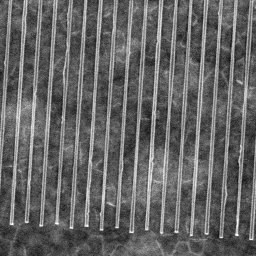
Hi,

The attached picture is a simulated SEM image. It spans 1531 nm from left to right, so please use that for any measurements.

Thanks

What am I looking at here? parallel lines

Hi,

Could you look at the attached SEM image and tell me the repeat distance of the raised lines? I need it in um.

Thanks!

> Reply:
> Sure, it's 0.0899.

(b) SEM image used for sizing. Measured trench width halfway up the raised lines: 71.6 nm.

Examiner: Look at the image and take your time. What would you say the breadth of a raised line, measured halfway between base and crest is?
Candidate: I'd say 17.2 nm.